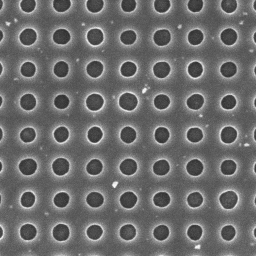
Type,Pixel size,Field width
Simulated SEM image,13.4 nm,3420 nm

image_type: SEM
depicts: a regular array of holes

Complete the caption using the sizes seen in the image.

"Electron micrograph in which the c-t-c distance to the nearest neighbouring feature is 0.431 microns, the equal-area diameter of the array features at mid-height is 0.222 µm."